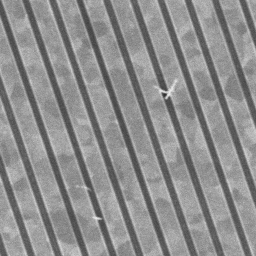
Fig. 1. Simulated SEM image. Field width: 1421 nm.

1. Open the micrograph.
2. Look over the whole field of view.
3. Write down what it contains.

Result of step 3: parallel lines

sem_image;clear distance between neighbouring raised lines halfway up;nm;38.1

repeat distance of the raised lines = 143 nm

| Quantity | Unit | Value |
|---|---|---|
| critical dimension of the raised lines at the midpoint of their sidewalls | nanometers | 104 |